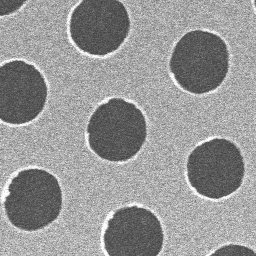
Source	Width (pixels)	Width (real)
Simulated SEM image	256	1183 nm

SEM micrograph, holes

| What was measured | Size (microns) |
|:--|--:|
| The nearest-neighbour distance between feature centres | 0.494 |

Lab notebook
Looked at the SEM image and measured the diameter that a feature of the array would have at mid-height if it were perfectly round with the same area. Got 277 nanometres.